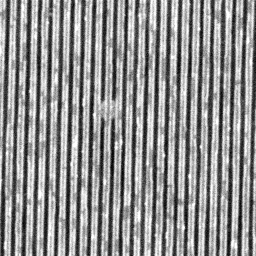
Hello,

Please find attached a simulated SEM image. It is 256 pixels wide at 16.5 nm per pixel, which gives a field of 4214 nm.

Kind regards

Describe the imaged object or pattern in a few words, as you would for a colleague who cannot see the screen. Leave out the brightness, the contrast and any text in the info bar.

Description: parallel lines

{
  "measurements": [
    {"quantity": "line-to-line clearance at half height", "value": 80.2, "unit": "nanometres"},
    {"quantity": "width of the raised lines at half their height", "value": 96.7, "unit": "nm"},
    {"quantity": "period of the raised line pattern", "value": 178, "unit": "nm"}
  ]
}